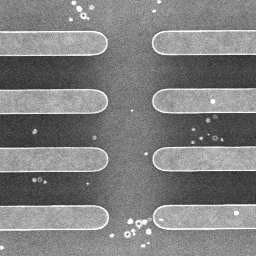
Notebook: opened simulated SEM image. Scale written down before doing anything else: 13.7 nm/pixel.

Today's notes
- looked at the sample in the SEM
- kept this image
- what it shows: groups of lines, slits or small figures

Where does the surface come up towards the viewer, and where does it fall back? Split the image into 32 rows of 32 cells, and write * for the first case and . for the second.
................................
................................
................................
................................
*************......*************
*************......*************
*************.......************
................................
................................
................................
................................
*************.......************
*************......*************
*************......*************
................................
................................
................................
................................
************........************
*************......*************
*************......*************
***.............................
................................
................................
................................
................................
*************......*************
*************......*************
*************.......************
................................
................................
................................